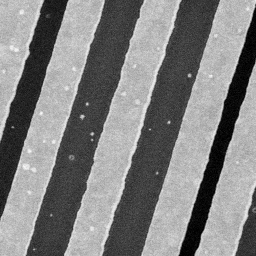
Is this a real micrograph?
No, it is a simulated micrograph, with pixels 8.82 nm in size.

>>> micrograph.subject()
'lines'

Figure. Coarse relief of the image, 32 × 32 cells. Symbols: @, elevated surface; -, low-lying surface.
@@@@@---@@@@@-----@@@@-----@@@@@
@@@@@---@@@@@-----@@@@-----@@@@@
@@@@@---@@@@-----@@@@@-----@@@@-
@@@@----@@@@-----@@@@@-----@@@@-
@@@@---@@@@@-----@@@@-----@@@@@-
@@@@---@@@@-----@@@@@-----@@@@@-
@@@@---@@@@-----@@@@@-----@@@@--
@@@---@@@@@-----@@@@-----@@@@@--
@@@---@@@@-----@@@@@-----@@@@---
@@@---@@@@-----@@@@@-----@@@@--@
@@---@@@@@-----@@@@-----@@@@@--@
@@---@@@@@----@@@@@-----@@@@---@
@@---@@@@-----@@@@@-----@@@@---@
@---@@@@@-----@@@@-----@@@@@--@@
@---@@@@@----@@@@@-----@@@@@--@@
@---@@@@-----@@@@@-----@@@@--@@@
----@@@@-----@@@@@----@@@@@--@@@
---@@@@@----@@@@@-----@@@@@--@@@
---@@@@-----@@@@@-----@@@@--@@@@
---@@@@-----@@@@@-----@@@@--@@@@
--@@@@@-----@@@@-----@@@@@--@@@@
--@@@@-----@@@@@-----@@@@@--@@@@
--@@@@-----@@@@@-----@@@@--@@@@@
-@@@@@-----@@@@-----@@@@@--@@@@@
-@@@@-----@@@@@-----@@@@@--@@@@@
-@@@@-----@@@@@-----@@@@--@@@@@-
@@@@@-----@@@@-----@@@@@--@@@@@-
@@@@-----@@@@@-----@@@@@--@@@@@-
@@@@-----@@@@@-----@@@@---@@@@--
@@@@-----@@@@-----@@@@@--@@@@@--
@@@@-----@@@@-----@@@@@--@@@@@--
@@@-----@@@@@-----@@@@--@@@@@@--